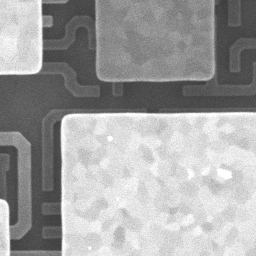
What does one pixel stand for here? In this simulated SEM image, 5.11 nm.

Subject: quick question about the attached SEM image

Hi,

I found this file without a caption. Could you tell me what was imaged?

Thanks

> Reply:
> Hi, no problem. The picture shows wiring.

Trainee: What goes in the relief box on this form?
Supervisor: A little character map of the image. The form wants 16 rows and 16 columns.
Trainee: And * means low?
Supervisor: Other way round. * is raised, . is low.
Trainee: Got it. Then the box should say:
***...*******...
***...*******...
***...*******...
***...*******...
**....*******...
................
................
....************
....************
....************
....************
....************
....************
*...************
*...************
*...************